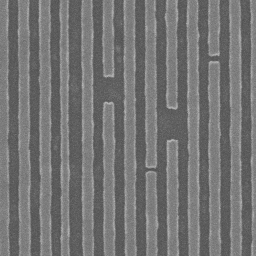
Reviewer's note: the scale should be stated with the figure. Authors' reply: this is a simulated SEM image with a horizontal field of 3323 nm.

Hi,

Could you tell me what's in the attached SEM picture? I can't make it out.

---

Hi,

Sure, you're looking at parallel lines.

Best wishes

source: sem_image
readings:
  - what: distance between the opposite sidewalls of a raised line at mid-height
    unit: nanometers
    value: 135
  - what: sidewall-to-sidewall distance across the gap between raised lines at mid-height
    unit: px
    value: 10.4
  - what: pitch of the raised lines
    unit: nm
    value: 274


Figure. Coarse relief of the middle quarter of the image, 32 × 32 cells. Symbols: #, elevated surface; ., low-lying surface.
#...###...##...###..###...##...#
#....##...##...###..###...##...#
#....##...##...###...##...##...#
#....##........###...##...##...#
#....##........###...##...##...#
#....##........###...##...##...#
#....##........###...##...##...#
#....##........###...##...##...#
#....##........###...##...##...#
#....##........###...##...##...#
#....##...##...###...##...##...#
#....##...##...###...##........#
#....##...##...###...##........#
#....##...##...###...##........#
#....##...##...###...##........#
#....##...##...###...##........#
#....##...###..###...##........#
#....##...##...###...##........#
#....##...###..###...##........#
#....##...###..###...##...##...#
#....##...###..###...##...##...#
#....##...###..###...##...##...#
#....##...##...###...##...##...#
#....##...##...###...##...##...#
#....##...##...###...##...##...#
#....##...##...###...##...##...#
#....##...##...###........##...#
#....##...##...###...##...##...#
#....##...###..###...##...##...#
#....##...###..###...##...##...#
#....##...##...###...##...##...#
#....##...##...###...##...##...#